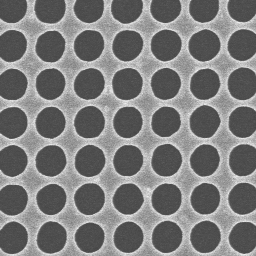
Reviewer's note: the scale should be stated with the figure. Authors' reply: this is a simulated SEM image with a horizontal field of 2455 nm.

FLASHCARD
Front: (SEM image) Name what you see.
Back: a regular array of holes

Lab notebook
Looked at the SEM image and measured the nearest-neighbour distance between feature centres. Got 0.365 micrometres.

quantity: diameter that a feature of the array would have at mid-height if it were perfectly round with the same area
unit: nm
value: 299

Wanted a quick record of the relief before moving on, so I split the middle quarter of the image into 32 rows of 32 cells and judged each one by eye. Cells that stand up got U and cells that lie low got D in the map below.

UUUUUUUUUUUUUUUUUUUUUUUUUUUUUUUU
UUUUUDDDUUUUUUDDDDUUUUUDDDDDUUUU
UUUUDDDDDUUUUDDDDDDUUUDDDDDDDUUU
UUUDDDDDDDUUDDDDDDDUUUDDDDDDDUUU
UUUDDDDDDDUUDDDDDDDDUUDDDDDDDUUD
UUDDDDDDDDUUDDDDDDDUUUDDDDDDDUUD
UUUDDDDDDDUUDDDDDDDUUUDDDDDDDUUD
UUUDDDDDDUUUUDDDDDDUUUDDDDDDUUUU
UUUUDDDDUUUUUUDDDDUUUUUDDDDUUUUU
UUUUUUUUUUUUUUUUUUUUUUUUUUUUUUUU
UUUUUUDUUUUUUUUUUUUUUUUUUUUUUUUU
UUUUDDDDDUUUUUDDDDUUUUUDDDDDUUUU
UUUDDDDDDDUUUDDDDDDUUUDDDDDDDUUU
UUUDDDDDDDUUDDDDDDDDUUDDDDDDDUUU
UUDDDDDDDDUUDDDDDDDDUUDDDDDDDUUD
UUUDDDDDDDUUDDDDDDDDUUDDDDDDDUUD
UUUDDDDDDDUUUDDDDDDUUUDDDDDDDUUU
UUUDDDDDDUUUUDDDDDUUUUUDDDDUUUUU
UUUUUDDUUUUUUUUDUUUUUUUUUUUUUUUU
UUUUUUUUUUUUUUUUUUUUUUUUUUUUUUUU
UUUUUDDDUUUUUUDDDDUUUUUDDDDUUUUU
UUUUDDDDDDUUUDDDDDDUUUUDDDDDDUUU
UUUDDDDDDDUUUDDDDDDDUUDDDDDDDUUU
UUUDDDDDDDUUDDDDDDDDUUDDDDDDDDUU
DUUDDDDDDDUUDDDDDDDDUUDDDDDDDDUD
UUUDDDDDDDUUDDDDDDDDUUDDDDDDDUUU
UUUDDDDDDDUUUDDDDDDUUUDDDDDDDUUU
UUUUDDDDDUUUUUDDDDUUUUUDDDDUUUUU
UUUUUUUUUUUUUUUUUUUUUUUUUUUUUUUU
UUUUUUUUUUUUUUUUUUUUUUUUUUUUUUUU
UUUUDDDDDUUUUUDDDDUUUUUUDDDDUUUU
UUUDDDDDDDUUUDDDDDDUUUUDDDDDDUUU